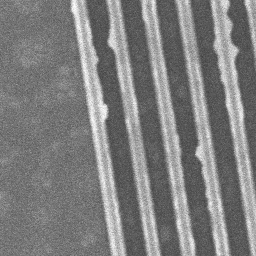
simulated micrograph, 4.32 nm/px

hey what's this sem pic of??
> parallel lines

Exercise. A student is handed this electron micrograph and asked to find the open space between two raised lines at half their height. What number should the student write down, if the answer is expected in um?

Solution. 0.0943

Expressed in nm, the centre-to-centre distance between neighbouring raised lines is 148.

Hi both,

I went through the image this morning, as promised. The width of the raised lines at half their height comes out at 54.4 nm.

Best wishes